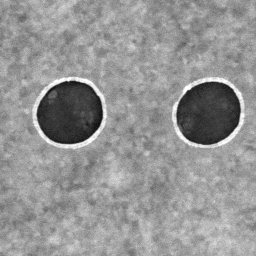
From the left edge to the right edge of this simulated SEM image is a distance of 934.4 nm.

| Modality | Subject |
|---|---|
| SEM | holes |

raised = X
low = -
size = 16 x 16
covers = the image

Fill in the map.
XXXXXXXXXXXXXXXX
XXXXXXXXXXXXXXXX
XXXXXXXXXXXXXXXX
XXXXXXXXXXXXXXXX
XXXXXXXXXXXXXXXX
XXX---XXXXXX--XX
XX----XXXXX----X
XX----XXXXX----X
XXX---XXXXX---XX
XXXXXXXXXXXXXXXX
XXXXXXXXXXXXXXXX
XXXXXXXXXXXXXXXX
XXXXXXXXXXXXXXXX
XXXXXXXXXXXXXXXX
XXXXXXXXXXXXXXXX
XXXXXXXXXXXXXXXX